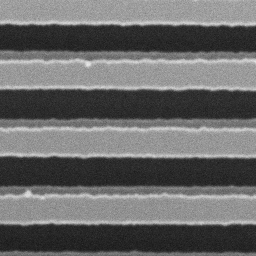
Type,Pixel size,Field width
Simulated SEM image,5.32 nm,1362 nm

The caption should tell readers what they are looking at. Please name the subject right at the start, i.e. lines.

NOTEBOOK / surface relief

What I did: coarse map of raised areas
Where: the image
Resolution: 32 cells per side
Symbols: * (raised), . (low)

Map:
********************************
********************************
********************************
................................
................................
................................
**..**..........................
********************************
********************************
********************************
********************************
................................
................................
................................
................................
********************************
********************************
********************************
********************************
..******************************
................................
................................
................................
********************************
********************************
********************************
********************************
********************************
................................
................................
................................
.*..............................